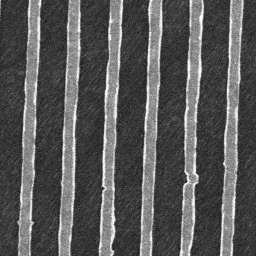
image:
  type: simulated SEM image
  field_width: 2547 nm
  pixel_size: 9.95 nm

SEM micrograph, parallel lines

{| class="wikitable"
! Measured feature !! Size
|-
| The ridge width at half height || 112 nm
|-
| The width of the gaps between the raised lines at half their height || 292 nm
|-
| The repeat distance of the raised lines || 402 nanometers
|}